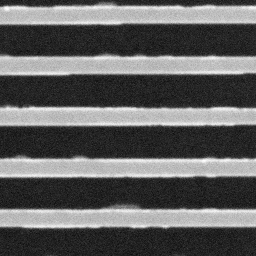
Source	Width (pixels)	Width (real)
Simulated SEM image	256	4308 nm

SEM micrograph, lines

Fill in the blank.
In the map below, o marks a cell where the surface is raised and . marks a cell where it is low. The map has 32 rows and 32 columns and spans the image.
................................
oooooooooooooooooooooooooooooooo
oooooooooooooooooooooooooooooooo
................................
................................
................................
................................
oooooooooooooooooooooooooooooooo
oooooooooooooooooooooooooooooooo
................................
................................
................................
................................
................................
oooooooooooooooooooooooooooooooo
oooooooooooooooooooooooooooooo..
................................
................................
................................
................................
oooooooooooooooooooooooooooooooo
oooooooooooooooooooooooooooooooo
................................
................................
................................
................................
oooooooooooooooooooooooooooooooo
oooooooooooooooooooooooooooooooo
................................
................................
................................
................................